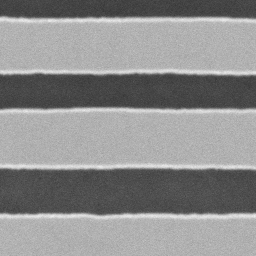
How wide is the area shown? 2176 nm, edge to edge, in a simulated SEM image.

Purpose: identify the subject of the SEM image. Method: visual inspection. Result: lines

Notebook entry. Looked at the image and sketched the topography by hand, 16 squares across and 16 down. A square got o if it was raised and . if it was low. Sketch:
................
oooooooooooooooo
oooooooooooooooo
oooooooooooooooo
oooooooooooooooo
................
................
oooooooooooooooo
oooooooooooooooo
oooooooooooooooo
...o..o.......oo
................
................
oooooo.ooooooooo
oooooooooooooooo
oooooooooooooooo